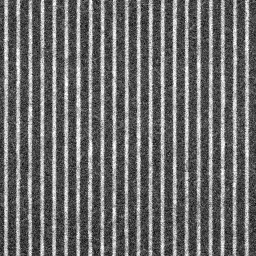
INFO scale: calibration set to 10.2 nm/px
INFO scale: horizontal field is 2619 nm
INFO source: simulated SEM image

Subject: parallel lines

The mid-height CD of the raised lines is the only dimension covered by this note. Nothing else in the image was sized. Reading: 24.3 nm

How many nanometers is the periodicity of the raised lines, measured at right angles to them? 123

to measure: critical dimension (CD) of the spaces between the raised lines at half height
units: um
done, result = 0.0985